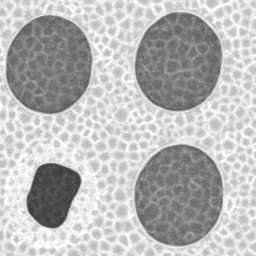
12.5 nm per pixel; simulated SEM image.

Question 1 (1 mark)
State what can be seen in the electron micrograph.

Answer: holes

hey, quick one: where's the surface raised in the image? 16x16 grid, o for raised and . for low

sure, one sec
oooooooooooooooo
oo...ooooo...ooo
o....oooo.....oo
......oo......oo
......oo......oo
o....oooo....ooo
o....ooooo...ooo
oooooooooooooooo
oooooooooooooooo
oooooooooo...ooo
oo..ooooo.....oo
oo...ooo......oo
oo...ooo......oo
oo..ooooo.....oo
ooooooooo....ooo
oooooooooooooooo